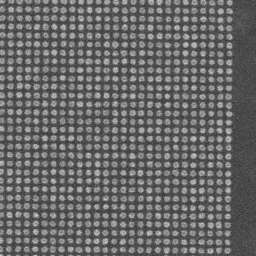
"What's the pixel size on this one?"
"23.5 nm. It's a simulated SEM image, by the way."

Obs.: a regular array of raised bodies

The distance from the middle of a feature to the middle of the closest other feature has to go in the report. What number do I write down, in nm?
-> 191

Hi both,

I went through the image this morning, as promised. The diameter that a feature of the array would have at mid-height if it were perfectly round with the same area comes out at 116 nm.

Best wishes